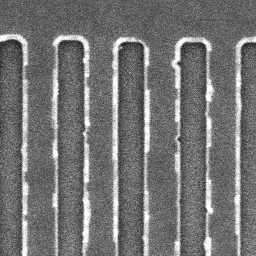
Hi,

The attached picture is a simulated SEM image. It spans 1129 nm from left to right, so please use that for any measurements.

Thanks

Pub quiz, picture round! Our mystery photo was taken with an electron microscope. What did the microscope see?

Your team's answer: one or a few lines or trenches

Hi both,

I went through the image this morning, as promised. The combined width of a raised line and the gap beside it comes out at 270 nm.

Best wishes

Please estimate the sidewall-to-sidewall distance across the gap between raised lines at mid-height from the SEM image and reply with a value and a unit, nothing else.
119 nm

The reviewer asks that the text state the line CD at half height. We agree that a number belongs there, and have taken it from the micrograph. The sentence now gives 149 nanometres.